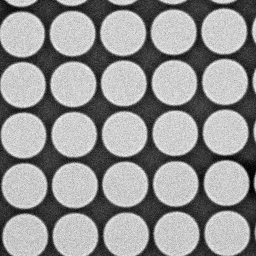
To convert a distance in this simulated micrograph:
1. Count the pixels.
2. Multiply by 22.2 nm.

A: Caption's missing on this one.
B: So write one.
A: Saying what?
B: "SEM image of an array of small figures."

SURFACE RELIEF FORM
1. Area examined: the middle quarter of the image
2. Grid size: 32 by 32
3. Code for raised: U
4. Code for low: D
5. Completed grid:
UUUUUUDDDDDDUUUUUUUDDDDDUUUUUUUD
UUUUUUUDDDUUUUUUUUUDDDDUUUUUUUUU
UUUUUUUDDDUUUUUUUUUUDDDUUUUUUUUU
UUUUUUUUDDUUUUUUUUUUDDUUUUUUUUUU
UUUUUUUUDDUUUUUUUUUUDDUUUUUUUUUU
UUUUUUUUDDUUUUUUUUUUDDUUUUUUUUUU
UUUUUUUUDDUUUUUUUUUUDDUUUUUUUUUU
UUUUUUUDDDUUUUUUUUUUDDDUUUUUUUUU
UUUUUUUDDDDUUUUUUUUDDDDDUUUUUUUU
UUUUUUDDDDDDUUUUUUDDDDDDDUUUUUDD
DDDDDDDDDDDDDDDDDDDDDDDDDDDDDDDD
DDDDDDDDDDDDDDDDDDDDDDDDDDDDDDDD
UUUUUDDDDDDDDUUUUUDDDDDDDUUUUUUD
UUUUUUDDDDDUUUUUUUUDDDDDUUUUUUUU
UUUUUUUDDDDUUUUUUUUUDDDUUUUUUUUU
UUUUUUUUDDUUUUUUUUUUDDDUUUUUUUUU
UUUUUUUUDDUUUUUUUUUUUDUUUUUUUUUU
UUUUUUUUDDUUUUUUUUUUUDUUUUUUUUUU
UUUUUUUUDDUUUUUUUUUUUDUUUUUUUUUU
UUUUUUUUDDUUUUUUUUUUDDDUUUUUUUUU
UUUUUUUDDDUUUUUUUUUUDDDUUUUUUUUU
UUUUUUUDDDDUUUUUUUUDDDDDUUUUUUUU
UUUUUDDDDDDDUUUUUUDDDDDDDDUUUUDD
DDDDDDDDDDDDDDDDDDDDDDDDDDDDDDDD
DDDDDDDDDDDDDDDDDDDDDDDDDDDDDDDD
UUUUUDDDDDDDUUUUUUDDDDDDDUUUUUUD
UUUUUUUDDDDUUUUUUUUUDDDDUUUUUUUU
UUUUUUUDDDUUUUUUUUUUDDDUUUUUUUUU
UUUUUUUUDDUUUUUUUUUUUDDUUUUUUUUU
UUUUUUUUDDUUUUUUUUUUUDUUUUUUUUUU
UUUUUUUUDDUUUUUUUUUUUDUUUUUUUUUU
UUUUUUUUDDUUUUUUUUUUUDDUUUUUUUUU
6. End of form